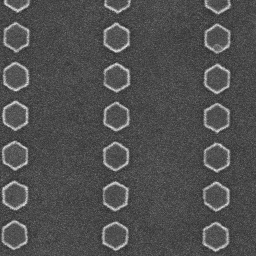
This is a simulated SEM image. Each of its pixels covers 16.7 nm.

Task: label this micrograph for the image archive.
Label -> a regular array of raised bodies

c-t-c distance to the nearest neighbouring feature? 660 nanometres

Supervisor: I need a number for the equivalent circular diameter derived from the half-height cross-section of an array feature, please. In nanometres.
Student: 421